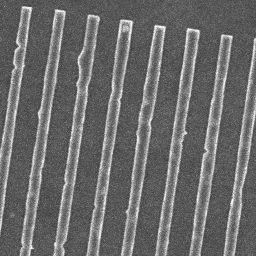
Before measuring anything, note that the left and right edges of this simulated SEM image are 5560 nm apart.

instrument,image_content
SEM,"parallel lines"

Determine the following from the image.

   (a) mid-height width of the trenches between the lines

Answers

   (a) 489 nm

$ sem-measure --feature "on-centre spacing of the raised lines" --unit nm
731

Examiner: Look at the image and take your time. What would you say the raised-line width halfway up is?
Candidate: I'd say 226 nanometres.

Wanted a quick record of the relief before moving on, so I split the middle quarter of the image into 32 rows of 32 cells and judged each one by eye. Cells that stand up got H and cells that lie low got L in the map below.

LLLLHHHLLLLLLHHLLLLLLHHHLLLLLLHH
LLLLHHHLLLLLLHHLLLLLLHHHLLLLLLHH
LLLLHHHLLLLLHHHLLLLLLHHHLLLLLHHH
LLLLHHHLLLLLHHHLLLLLLHHHLLLLLHHH
LLLHHHLLLLLLHHHLLLLLHHHHLLLLLHHH
LLLHHHLLLLLLHHHLLLLLHHHLLLLLLHHH
LLLHHHLLLLLLHHLLLLLLHHHLLLLLLHHH
LLLHHHLLLLLLHHLLLLLLHHHLLLLLLHHH
LLLHHHLLLLLLHHLLLLLLHHHLLLLLLHHL
LLLHHHLLLLLHHHLLLLLLHHHLLLLLHHHL
LLLHHLLLLLLHHHLLLLLLHHLLLLLLHHHL
LLLHHLLLLLLHHHLLLLLHHHLLLLLLHHHL
LLLHHLLLLLLHHHLLLLLHHHLLLLLLHHHL
LLHHHLLLLLLHHLLLLLLHHHLLLLLLHHHL
LLHHHLLLLLLHHLLLLLLHHHLLLLLLHHLL
LLHHHLLLLLHHHLLLLLLHHHLLLLLLHHLL
LLHHHLLLLLHHHLLLLLHHHHLLLLLHHHLL
LLHHLLLLLLHHHLLLLLHHHLLLLLLHHHLL
LLHHLLLLLLHHHLLLLLHHHLLLLLLHHHLL
LLHHLLLLLLHHHLLLLLHHHLLLLLLHHLLL
LHHHLLLLLLHHLLLLLLHHHLLLLLLHHLLL
LHHHLLLLLLHHLLLLLLHHHLLLLLLHHLLL
LHHHLLLLLLHHLLLLLLHHHLLLLLHHHLLL
LHHLLLLLLLHHLLLLLLHHHLLLLLHHHLLL
LHHLLLLLLHHHLLLLLLHHLLLLLLHHHLLL
LHHLLLLLLHHLLLLLLLHHLLLLLLHHHLLL
LHHLLLLLLHHLLLLLLHHHLLLLLLHHHLLL
HHHLLLLLLHHLLLLLLHHHLLLLLLHHLLLL
HHHLLLLLLHHLLLLLLHHHLLLLLLHHLLLL
HHHLLLLLHHHLLLLLLHHHLLLLLLHHLLLL
HHLLLLLLHHHLLLLLLHHHLLLLLLHHLLLL
HHLLLLLLHHHLLLLLLHHLLLLLLHHHLLLL